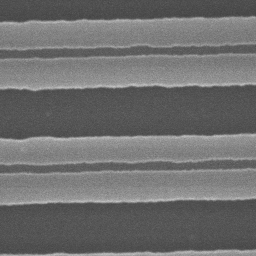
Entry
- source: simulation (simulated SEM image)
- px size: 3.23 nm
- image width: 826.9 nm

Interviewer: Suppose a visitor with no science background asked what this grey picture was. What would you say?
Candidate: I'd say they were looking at lines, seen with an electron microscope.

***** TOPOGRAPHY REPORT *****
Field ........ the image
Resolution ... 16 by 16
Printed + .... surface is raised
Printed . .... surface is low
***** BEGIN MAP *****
................
++++++++++++++++
++++++++++++++++
++++++++++++++++
++++++++++++++++
++++++..........
................
................
............++++
++++++++++++++++
++++++++++++++++
++++++++++++++++
+++++++++++.....
................
................
................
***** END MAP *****